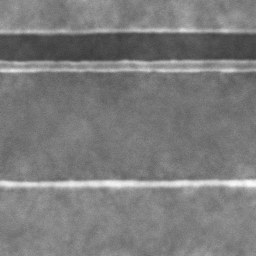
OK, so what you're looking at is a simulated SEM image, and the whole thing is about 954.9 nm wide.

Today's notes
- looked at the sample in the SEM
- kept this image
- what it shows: lines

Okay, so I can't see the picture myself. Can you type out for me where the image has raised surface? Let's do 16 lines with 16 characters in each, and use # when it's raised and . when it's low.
################
################
................
................
................
................
................
................
................
................
................
#....####..#####
################
################
################
################